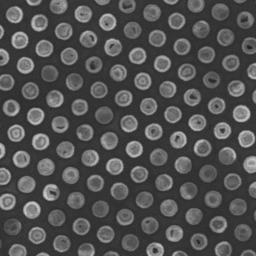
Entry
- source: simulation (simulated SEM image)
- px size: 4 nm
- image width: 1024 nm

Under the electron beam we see a regular array of raised bodies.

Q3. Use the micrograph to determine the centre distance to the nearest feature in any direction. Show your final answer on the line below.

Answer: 103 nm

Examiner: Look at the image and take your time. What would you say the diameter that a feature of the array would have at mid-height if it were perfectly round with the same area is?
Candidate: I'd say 66.6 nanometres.